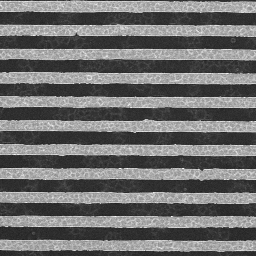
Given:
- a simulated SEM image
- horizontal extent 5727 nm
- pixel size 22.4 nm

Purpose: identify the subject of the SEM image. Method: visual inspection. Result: parallel lines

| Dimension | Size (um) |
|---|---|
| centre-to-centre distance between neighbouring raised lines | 0.534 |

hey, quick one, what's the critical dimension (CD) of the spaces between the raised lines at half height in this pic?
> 305 nm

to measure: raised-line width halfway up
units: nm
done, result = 221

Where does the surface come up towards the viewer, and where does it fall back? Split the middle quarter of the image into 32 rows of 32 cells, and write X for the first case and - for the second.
--------------------------------
--------------------------------
XXXXXXXXX-------X--XXXXXXX----XX
XXXXXXXXXXXXXXXXXXXXXXXXXXXXXXXX
XXXXXXXXXXXXXXXXXXXXXXXXXXX-XXXX
--------------------------------
--------------------------------
--------------------------------
XXXXXXXXXXXXX----XXXXXXXXXXXXXXX
XXXXXXXXXXXXXXXXXXXXXXXXXXXXXXXX
XXXXXXXXXXXXXXXXXXXXXXXXXXXXXXXX
--------------------------------
--------------------------------
--------------------------------
XXXXXXXXXXXXXXX-XXXXXXXXXXXXXXXX
XXXXXXXXXXXXXXXXXXXXXXXXXXXXXXXX
XXXXXXXXXXXXXXXXXXXXXXXXXXXXXXXX
--------------------------------
--------------------------------
--------------------------------
XXXXXXXXXXXXXXXXXXXXXXXXXXXXXXXX
XXXXXXXXXXXXXXXXXXXXXXXXXXXXXXXX
XXXXXXXXXXXXXXXXXXXXXXXXXXXXXXXX
--------------------------------
--------------------------------
--------------------------------
XXXXXXXXXXXXXXXXXXXXXXXXXXXXXXXX
XXXXXXXXXXXXXXXXXXXXXXXXXXXXXXXX
XXXXXXXXXXXX--XXXXXXXXXXXXXXXXXX
--------------------------------
--------------------------------
--------------------------------